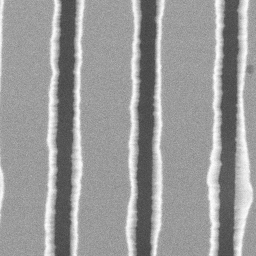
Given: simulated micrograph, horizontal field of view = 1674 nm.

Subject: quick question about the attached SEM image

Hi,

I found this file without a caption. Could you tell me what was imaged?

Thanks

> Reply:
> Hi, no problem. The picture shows lines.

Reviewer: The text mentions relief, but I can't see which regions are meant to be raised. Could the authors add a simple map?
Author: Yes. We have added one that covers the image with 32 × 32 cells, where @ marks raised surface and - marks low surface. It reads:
@@@@@@@---@@@@@@@---@@@@@@@@--@@
@@@@@@@---@@@@@@@---@@@@@@@@--@@
@@@@@@@---@@@@@@@---@@@@@@@@--@@
@@@@@@@---@@@@@@@---@@@@@@@@--@@
@@@@@@@---@@@@@@@---@@@@@@@@--@@
@@@@@@@---@@@@@@@---@@@@@@@@--@@
@@@@@@@---@@@@@@@---@@@@@@@@--@@
@@@@@@@---@@@@@@@---@@@@@@@@--@@
@@@@@@@---@@@@@@@---@@@@@@@---@@
@@@@@@@--@@@@@@@@---@@@@@@@---@@
@@@@@@@---@@@@@@@---@@@@@@@---@@
@@@@@@@--@@@@@@@@---@@@@@@@---@@
@@@@@@@--@@@@@@@@--@@@@@@@@---@@
@@@@@@@--@@@@@@@@---@@@@@@@---@@
@@@@@@@--@@@@@@@@---@@@@@@@---@@
@@@@@@@--@@@@@@@@---@@@@@@@---@@
@@@@@@@--@@@@@@@@--@@@@@@@@---@@
@@@@@@@--@@@@@@@@--@@@@@@@@---@@
@@@@@@@--@@@@@@@@--@@@@@@@@---@@
@@@@@@@--@@@@@@@@--@@@@@@@@---@@
@@@@@@@--@@@@@@@@--@@@@@@@@---@@
@@@@@@@--@@@@@@@@--@@@@@@@@---@@
@@@@@@@--@@@@@@@@--@@@@@@@@---@@
@@@@@@@--@@@@@@@@--@@@@@@@@---@@
@@@@@@@--@@@@@@@@--@@@@@@@@---@@
@@@@@@@--@@@@@@@@--@@@@@@@@---@@
@@@@@@@--@@@@@@@@--@@@@@@@@---@@
@@@@@@---@@@@@@@@--@@@@@@@@---@@
@@@@@@---@@@@@@@@--@@@@@@@@---@@
@@@@@@---@@@@@@@@--@@@@@@@@---@@
@@@@@@---@@@@@@@@--@@@@@@@@---@@
@@@@@@---@@@@@@@@--@@@@@@@@--@@@